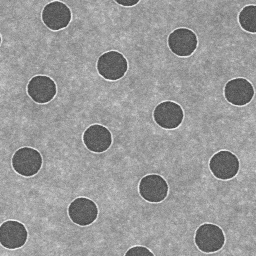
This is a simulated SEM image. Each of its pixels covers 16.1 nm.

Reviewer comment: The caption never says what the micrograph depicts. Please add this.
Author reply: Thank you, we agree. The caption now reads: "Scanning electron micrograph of a regular array of holes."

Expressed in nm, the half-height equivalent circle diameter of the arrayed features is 467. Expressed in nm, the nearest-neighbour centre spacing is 1190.